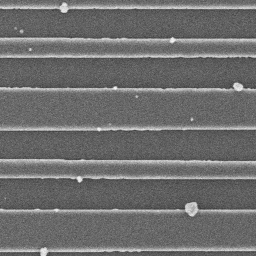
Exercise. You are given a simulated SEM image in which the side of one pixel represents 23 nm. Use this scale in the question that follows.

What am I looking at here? lines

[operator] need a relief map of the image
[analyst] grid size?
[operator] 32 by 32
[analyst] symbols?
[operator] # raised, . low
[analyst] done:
################################
................................
................................
................................
................................
################################
################################
................................
................................
................................
................................
################################
################################
################################
################################
################################
................................
................................
................................
................................
################################
################################
................................
................................
................................
.......................#........
################################
################################
################################
################################
################################
.....#..........................